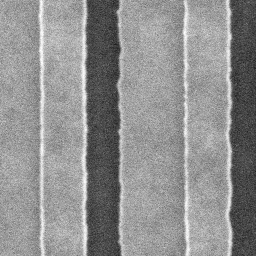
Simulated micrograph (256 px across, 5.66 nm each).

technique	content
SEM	lines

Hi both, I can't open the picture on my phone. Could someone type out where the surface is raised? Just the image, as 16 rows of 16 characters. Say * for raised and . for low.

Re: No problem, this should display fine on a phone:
*****..*******..
*****..*******..
*****...******..
*****...******..
*****...******..
*****..*******..
*****..*******..
*****...******..
*****...******..
*****...******..
*****...******..
*****...******..
*****...******..
*****...******..
*****...******..
*****...******..